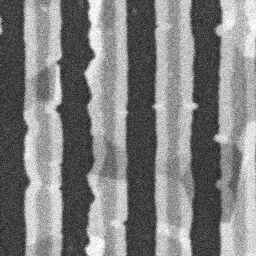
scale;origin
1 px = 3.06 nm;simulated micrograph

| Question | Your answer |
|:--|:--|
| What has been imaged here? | one or a few lines or trenches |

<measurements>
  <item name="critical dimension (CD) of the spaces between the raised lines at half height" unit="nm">112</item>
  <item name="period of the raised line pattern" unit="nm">199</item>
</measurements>